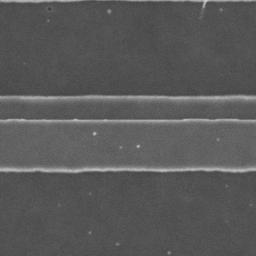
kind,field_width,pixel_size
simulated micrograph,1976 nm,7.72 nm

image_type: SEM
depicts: lines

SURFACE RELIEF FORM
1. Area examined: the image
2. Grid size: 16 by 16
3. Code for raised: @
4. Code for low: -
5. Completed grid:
----------------
----------------
----------------
----------------
----------------
----------------
@@@@@@@@@@@@@@@@
@@@@@@@@@@@@@@@@
@@@@@@@@@@@@@@@@
@@@@@@@@@@@@@@@@
@@@@@@@@@@@@@@@@
----------------
----------------
----------------
----------------
----------------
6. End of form